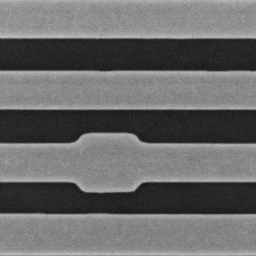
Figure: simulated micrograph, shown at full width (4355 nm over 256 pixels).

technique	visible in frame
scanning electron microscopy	wiring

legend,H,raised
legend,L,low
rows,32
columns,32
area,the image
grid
HHHHHHHHHHHHHHHHHHHHHHHHHHHHHHHH
HHHHHHHHHHHHHHHHHHHHHHHHHHHHHHHH
HHHHHHHHHHHHHHHHHHHHHHHHHHHHHHHH
HHHHHHHHHHHHHHHHHHHHHHHHHHHHHHHH
HHHHHHHHHHHHHHHHHHHHHHHHHHHHHHHH
LLLLLLLLLLLLLLLLLLLLLLLLLLLLLLLL
LLLLLLLLLLLLLLLLLLLLLLLLLLLLLLLL
LLLLLLLLLLLLLLLLLLLLLLLLLLLLLLLL
LLLLLLLLLLLLLLLLLLLLLLLLLLLLLLLL
HHHHHHHHHHHHHHHHHHHHHHHHHHHHHHHH
HHHHHHHHHHHHHHHHHHHHHHHHHHHHHHHH
HHHHHHHHHHHHHHHHHHHHHHHHHHHHHHHH
HHHHHHHHHHHHHHHHHHHHHHHHHHHHHHHH
LLLLLLLLLLHHHLLLLLLLLLLLLLLLLLLL
LLLLLLLLLLLLLLLLLLLLLLLLLLLLLLLL
LLLLLLLLLLLLLLLLLLLLLLLLLLLLLLLL
LLLLLLLLLLLLLLLLLLLLLLLLLLLLLLLL
LLLLLLLLLLHHHHHHHLLLLLLLLLLLLLLL
HHHHHHHHHHHHHHHHHHHHHHHHHHHHHHHH
HHHHHHHHHHHHHHHHHHHHHHHHHHHHHHHH
HHHHHHHHHHHHHHHHHHHHHHHHHHHHHHHH
HHHHHHHHHHHHHHHHHHHHHHHHHHHHHHHH
HHHHHHHHHHHHHHHHHHHHHHHHHHHHHHHH
LLLLLLLLLLHHHHHHHLLLLLLLLLLLLLLL
LLLLLLLLLLLLLLLLLLLLLLLLLLLLLLLL
LLLLLLLLLLLLLLLLLLLLLLLLLLLLLLLL
LLLLLLLLLLLLLLLLLLLLLLLLLLLLLLLL
HHHHHHHHHHHHHHHHHHHHHHHHHHHHHHHH
HHHHHHHHHHHHHHHHHHHHHHHHHHHHHHHH
HHHHHHHHHHHHHHHHHHHHHHHHHHHHHHHH
HHHHHHHHHHHHHHHHHHHHHHHHHHHHHHHH
HHHHHHHHHHHHHHHHHHHHHHHHHHHHHHHH